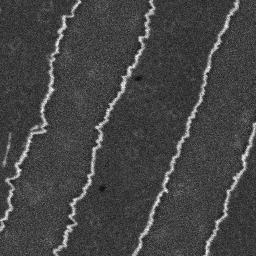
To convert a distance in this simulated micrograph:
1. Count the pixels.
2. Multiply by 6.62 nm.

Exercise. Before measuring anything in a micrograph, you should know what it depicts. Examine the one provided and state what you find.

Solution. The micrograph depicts one or a few lines or trenches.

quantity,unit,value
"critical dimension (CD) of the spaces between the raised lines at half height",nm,428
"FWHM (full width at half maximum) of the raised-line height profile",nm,496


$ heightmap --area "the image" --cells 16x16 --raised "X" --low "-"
XXXXX----XXXXXX-
XXXX-----XXXXX--
XXXX-----XXXXX--
XXX------XXXX---
XXX-----XXXXX---
XXX-----XXXXX---
XXX----XXXXX----
XXX----XXXXX----
XX----XXXXXX----
XX----XXXXX----X
X-----XXXXX----X
X----XXXXX-----X
X----XXXXX----XX
-----XXXXX----XX
----XXXXX----XXX
----XXXXX----XXX